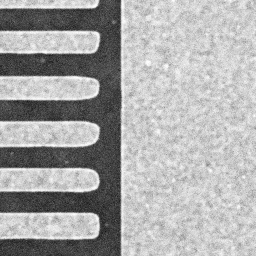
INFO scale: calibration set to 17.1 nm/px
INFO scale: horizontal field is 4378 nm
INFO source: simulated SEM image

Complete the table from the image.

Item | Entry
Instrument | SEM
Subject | wiring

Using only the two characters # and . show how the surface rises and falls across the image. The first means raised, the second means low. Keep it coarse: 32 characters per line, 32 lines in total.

############...#################
...............#################
...............#################
...............#################
############...#################
############...#################
..##########...#################
...............#################
...............#################
...............#################
############...#################
############...#################
...............#################
...............#################
...............#################
############...#################
############...#################
############...#################
...............#################
...............#################
...............#################
############...#################
############...#################
############...#################
...............#################
...............#################
...............#################
############...#################
############...#################
############...#################
...............#################
...............#################